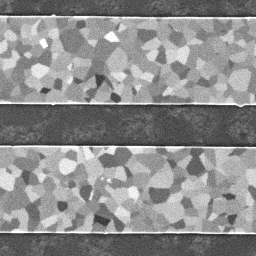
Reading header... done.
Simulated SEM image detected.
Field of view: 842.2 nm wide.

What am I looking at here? one or a few lines or trenches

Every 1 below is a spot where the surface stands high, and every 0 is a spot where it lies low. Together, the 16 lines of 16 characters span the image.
0000000000000000
1111111111111111
1111111111111111
1111111111111111
1111111111111111
1111111111111111
0001000000000111
0000000000000000
0000000000000000
1111111111111111
1111111111111111
1111111111111111
1111111111111111
1111111111111111
0001111111111111
0000000000000000